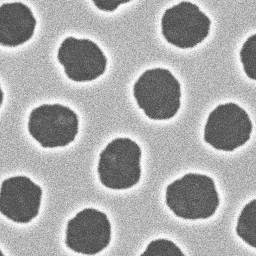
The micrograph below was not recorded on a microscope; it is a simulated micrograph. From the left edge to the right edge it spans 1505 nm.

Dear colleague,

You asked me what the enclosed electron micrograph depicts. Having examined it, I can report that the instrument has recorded holes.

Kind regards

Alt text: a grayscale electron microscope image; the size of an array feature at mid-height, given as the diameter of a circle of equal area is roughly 284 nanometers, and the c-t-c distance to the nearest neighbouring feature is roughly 434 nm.